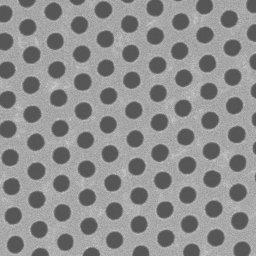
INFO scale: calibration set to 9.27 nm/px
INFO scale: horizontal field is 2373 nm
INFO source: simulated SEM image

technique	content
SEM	a regular array of holes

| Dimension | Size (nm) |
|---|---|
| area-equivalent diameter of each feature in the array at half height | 163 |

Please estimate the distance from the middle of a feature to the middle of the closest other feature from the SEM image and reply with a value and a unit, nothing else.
260 nm